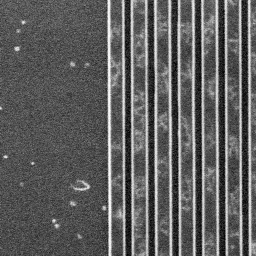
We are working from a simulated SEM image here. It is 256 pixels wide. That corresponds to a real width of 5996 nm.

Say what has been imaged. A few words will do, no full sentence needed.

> parallel lines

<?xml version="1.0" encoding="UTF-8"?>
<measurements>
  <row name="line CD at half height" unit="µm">0.343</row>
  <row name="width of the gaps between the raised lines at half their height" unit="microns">0.205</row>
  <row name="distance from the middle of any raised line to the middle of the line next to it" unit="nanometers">547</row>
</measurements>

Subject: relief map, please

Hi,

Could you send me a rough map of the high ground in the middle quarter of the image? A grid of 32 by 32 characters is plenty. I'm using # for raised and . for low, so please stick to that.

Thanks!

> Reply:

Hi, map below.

...........####..###...###...###
...........####..###...###...###
...........####..###...###...###
...........####..###...###...###
...........####..###...###...###
...........####..####..###...###
...........####..####..###...###
...........####..####..###...###
...........####..####..###...###
...........####..####..####..###
...........####..####..####..###
...........####..####..####..###
...........####..####..####..###
...........####..####..####..###
...........####..####..####..###
...........####..####..####..###
...........####..####..####..###
...........####..####..####..###
...........####..####..####..###
...........####..####..####..###
...........####..####..####..###
...........####..####..####..###
...........####..####..####..###
...........####..####..####..###
...........####..####..####..###
...........####..####..####..###
...........####..####..####..###
...........####..####..####..###
...........####..####..####..###
...........####..####..####..###
...........####..####..####..###
............###..####..####..###